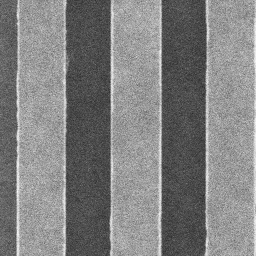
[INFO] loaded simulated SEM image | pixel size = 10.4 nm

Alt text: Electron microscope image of lines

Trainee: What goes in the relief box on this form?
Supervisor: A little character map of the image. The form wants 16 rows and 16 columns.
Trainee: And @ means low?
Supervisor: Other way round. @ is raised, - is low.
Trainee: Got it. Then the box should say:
-@@@---@@@---@@@
-@@@---@@@---@@@
-@@@---@@@---@@@
-@@@---@@@---@@@
-@@@---@@@---@@@
-@@@---@@@---@@@
-@@@---@@@---@@@
-@@@---@@@---@@@
-@@@---@@@---@@@
-@@@---@@@---@@@
-@@@---@@@---@@@
-@@@---@@@---@@@
-@@@---@@@---@@@
-@@@---@@@---@@@
-@@@---@@@---@@@
-@@@---@@@---@@@